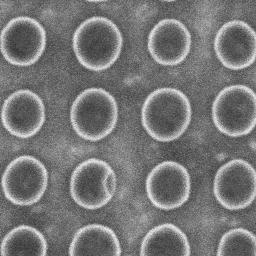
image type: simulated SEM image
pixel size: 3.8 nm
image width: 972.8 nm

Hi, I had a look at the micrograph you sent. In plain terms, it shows a regular array of raised bodies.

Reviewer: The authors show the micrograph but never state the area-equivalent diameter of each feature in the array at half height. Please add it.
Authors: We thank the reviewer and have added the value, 0.174 microns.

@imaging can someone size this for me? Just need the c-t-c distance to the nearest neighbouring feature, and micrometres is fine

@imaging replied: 0.27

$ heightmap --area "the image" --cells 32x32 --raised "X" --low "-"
--------------------------------
--------------------------------
--XX-------XX-------------------
-XXXX-----XXXXX----XXXX-----XXX-
XXXXX----XXXXXX----XXXXX---XXXXX
XXXXX----XXXXXX----XXXXX---XXXXX
XXXXX----XXXXXX----XXXX----XXXXX
-XXX------XXXX------XXX-----XXXX
-----------XX----------------X--
--------------------------------
--------------------------------
--XX-------XX------XXX------XXXX
-XXXX----XXXXX----XXXXX----XXXXX
XXXXX----XXXXXX---XXXXXX---XXXXX
XXXXX----XXXXXX---XXXXXX---XXXXX
-XXXX----XXXXX----XXXXX----XXXXX
-XXX------XXXX-----XXXX-----XXX-
-----------X--------X-----------
--------------------------------
--------------------------------
-XXXX-----XXX-------XX------XXX-
-XXXXX---XXXXX-----XXXX----XXXXX
XXXXXX---XXXX------XXXXX---XXXXX
-XXXXX---XXXX-----XXXXXX---XXXXX
-XXXX----XXXXX-----XXXX----XXXXX
--XX------XXX------XXXX-----XXX-
--------------------------------
--------------------------------
--XX-------XX-------XX----------
-XXXX----XXXXX----XXXXX-----XXXX
XXXXXX---XXXXXX---XXXXX-----XXXX
XXXXXX---XXXXXX---XXXXXX---XXXXX